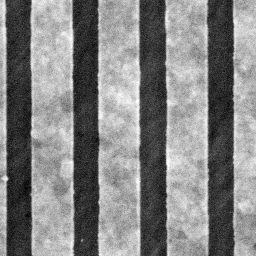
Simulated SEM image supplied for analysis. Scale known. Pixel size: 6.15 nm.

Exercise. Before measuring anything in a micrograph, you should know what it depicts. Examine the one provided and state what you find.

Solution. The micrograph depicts lines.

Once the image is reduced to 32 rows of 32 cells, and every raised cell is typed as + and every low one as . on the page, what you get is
+...+++++...+++++....+++++...+++
+...+++++...+++++....+++++...+++
+...+++++...+++++....+++++...+++
+...+++++...+++++....+++++...+++
+...+++++...+++++....+++++...+++
+...+++++...+++++....+++++...+++
+...+++++...+++++....+++++...+++
+...+++++...+++++....+++++...+++
+...+++++...+++++....+++++...+++
+...+++++...+++++....+++++...+++
+...+++++...+++++....+++++...+++
+...+++++...+++++....+++++...+++
+...+++++...+++++....+++++...+++
+...+++++...+++++....+++++...+++
+...+++++...+++++....+++++...+++
+...+++++...+++++....+++++...+++
+...+++++...+++++....+++++...+++
+...+++++....++++....+++++...+++
+...+++++...+++++....+++++...+++
+...+++++...+++++....+++++...+++
+...+++++...+++++....+++++...+++
+...+++++...+++++....+++++...+++
+...+++++...+++++....+++++...+++
+...+++++....++++....+++++...+++
+...+++++....++++....+++++...+++
+...+++++...+++++....+++++...+++
+...+++++....++++....+++++...+++
+...+++++...+++++....+++++...+++
+...+++++...+++++....+++++...+++
+...+++++...+++++....+++++...+++
+...+++++...+++++....+++++...+++
+...+++++...+++++....+++++...+++